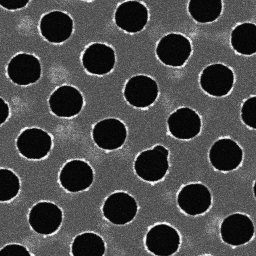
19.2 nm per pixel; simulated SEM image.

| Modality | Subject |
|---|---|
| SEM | a regular array of holes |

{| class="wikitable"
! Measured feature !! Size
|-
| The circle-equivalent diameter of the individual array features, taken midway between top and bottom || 0.634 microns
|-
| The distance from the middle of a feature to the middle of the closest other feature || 1010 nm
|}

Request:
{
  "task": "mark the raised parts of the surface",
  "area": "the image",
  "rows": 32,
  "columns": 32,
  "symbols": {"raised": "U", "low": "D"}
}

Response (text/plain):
DDDUUUUUUUUUUUUDDDUUUUUUDDDDUUUU
UUUUUUDDUUUUUUDDDDUUUUUUDDDDUUUU
UUUUUDDDDUUUUUDDDDUUUUUUDDDUUUUU
UUUUUDDDDUUUUUUDDDUUUUUUUUUUUDDD
UUUUUDDDDUUUUUUUUUUUUDDUUUUUUDDD
UUUUUUUUUUUUDUUUUUUUDDDDUUUUUDDD
UUUUUUUUUUUDDDUUUUUUDDDDUUUUUUDD
UDDDDUUUUUDDDDUUUUUUDDDUUUUUUUUU
UDDDDUUUUUUDDDUUUUUUUUUUUUDDDUUU
UDDDDUUUUUUUUUUUUDUUUUUUUDDDDUUU
UUDDUUUUUUUUUUUUDDDDUUUUUDDDDUUU
UUUUUUUDDDUUUUUUDDDDUUUUUUDDDUUU
UUUUUUDDDDUUUUUUDDDUUUUUUUUUUUUD
DUUUUUDDDDUUUUUUUUUUUUUDUUUUUUDD
DUUUUUUDDUUUUUUUUUUUUDDDDUUUUUDD
UUUUUUUUUUUUDDDUUUUUUDDDDUUUUUUD
UUUDDDUUUUUUDDDDUUUUUDDDDUUUUUUU
UUDDDDUUUUUUDDDDUUUUUUUUUUUDDUUU
UUDDDDUUUUUUUDDUUUUDDUUUUUDDDDUU
UUUDDDUUUUUUUUUUUDDDDUUUUUDDDDUU
UUUUUUUUDDDUUUUUUDDDDUUUUUDDDDUU
DDUUUUUUDDDDUUUUUDDDDUUUUUUUUUUU
DDUUUUUDDDDDUUUUUUDDUUUUUUUUUUUU
DDUUUUUUDDDUUUUUUUUUUUUDDDUUUUUU
DDUUUUUUUUUUUUDDUUUUUUDDDDUUUUUU
UUUUUDDUUUUUUDDDDUUUUUDDDDUUUUUU
UUUUDDDDUUUUUDDDDUUUUUUDDDUUUUUU
UUUUDDDDUUUUUUDDUUUUUUUUUUUUDDDU
UUUUDDDUUUUUUUUUUUUDDDUUUUUUDDDD
UUUUUUUUUUDDUUUUUUDDDDUUUUUUDDDD
UUUUUUUUUDDDDUUUUUDDDDUUUUUUUDUU
DDDDUUUUUDDDDUUUUUUDDDUUUUUUUUUU